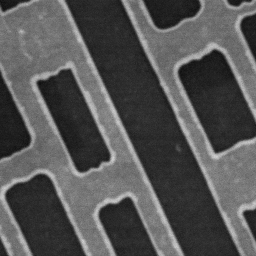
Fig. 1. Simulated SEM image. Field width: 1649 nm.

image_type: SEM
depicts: one or a few lines or trenches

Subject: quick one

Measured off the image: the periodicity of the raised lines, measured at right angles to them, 434 nanometres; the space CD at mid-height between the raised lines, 345 nanometers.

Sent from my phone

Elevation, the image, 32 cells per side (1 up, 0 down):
00011111000000001100000001110001
01111111100000001100000001111111
11111111100000000110000111111100
11111111100000000110001111111100
11111111110000000111111111111100
11111111110000000011111111111110
11111111111000000011111111001110
11111111111000000001111100000111
11111111011100000001110000000111
11111100001100000000110000000011
01110000001110000000110000000011
00111000000110000000011000000001
00111000000111000000011000000001
00111100000111000000001100000001
00011100000011100000001100000000
00011110000011100000000110000000
00001110000001110000000110000000
00001111000001110000000011000000
00011111000000110000000011000111
00111111100000111000000001111111
11111111100001111000000001111111
11111111110111111100000000111111
11100001111111111100000000111111
10000001111111111110000000111111
00000001111111111110000000011111
10000000111110000111000000011111
10000000111100000111000000001100
11000000011100000011100000001100
11000000011110000011100000000110
11100000001110000001110000000110
01100000001111000001110000000011
01110000000111000000111000000011